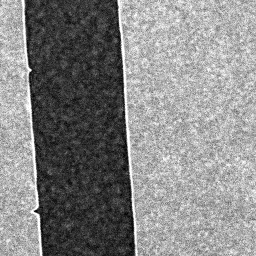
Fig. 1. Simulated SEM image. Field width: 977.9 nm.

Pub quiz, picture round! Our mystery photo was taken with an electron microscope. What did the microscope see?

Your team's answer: one or a few lines or trenches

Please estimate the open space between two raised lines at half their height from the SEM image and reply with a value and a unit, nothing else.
365 nm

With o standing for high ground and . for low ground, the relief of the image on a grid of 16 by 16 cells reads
o......ooooooooo
oo......oooooooo
oo......oooooooo
oo......oooooooo
oo......oooooooo
oo......oooooooo
oo......oooooooo
oo......oooooooo
oo......oooooooo
oo......oooooooo
oo......oooooooo
oo......oooooooo
oo......oooooooo
oo......oooooooo
oo......oooooooo
ooo.....oooooooo